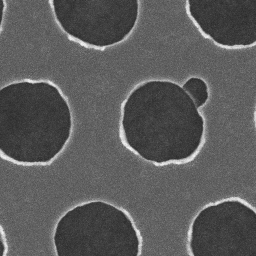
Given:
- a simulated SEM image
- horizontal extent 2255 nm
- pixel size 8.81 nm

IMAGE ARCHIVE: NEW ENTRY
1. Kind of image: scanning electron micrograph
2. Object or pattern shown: holes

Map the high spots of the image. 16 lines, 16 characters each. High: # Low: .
###......###....
####....####....
#####...#####...
################
################
...######....###
....####.....###
....####.....###
....####.....###
....#####...####
################
################
################
####....####....
###.....####....
###......###....